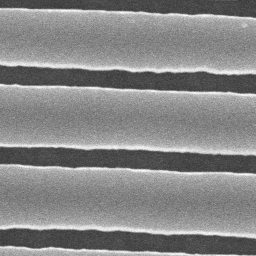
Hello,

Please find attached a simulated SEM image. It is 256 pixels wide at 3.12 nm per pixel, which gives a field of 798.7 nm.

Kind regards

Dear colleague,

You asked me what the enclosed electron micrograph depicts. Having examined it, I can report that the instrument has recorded lines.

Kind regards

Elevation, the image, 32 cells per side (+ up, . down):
................................
+++++++++++++++++...............
++++++++++++++++++++++++++++++++
++++++++++++++++++++++++++++++++
++++++++++++++++++++++++++++++++
++++++++++++++++++++++++++++++++
++++++++++++++++++++++++++++++++
++++++++++++++++++++++++++++++++
.......+.+++++++++++++++++++++++
................................
................................
+++++++++++++++++++++++.........
++++++++++++++++++++++++++++++++
++++++++++++++++++++++++++++++++
++++++++++++++++++++++++++++++++
++++++++++++++++++++++++++++++++
++++++++++++++++++++++++++++++++
++++++++++++++++++++++++++++++++
..........++++++++++++++++++++++
................................
................................
+++++++++++++++++++++++.........
++++++++++++++++++++++++++++++++
++++++++++++++++++++++++++++++++
++++++++++++++++++++++++++++++++
++++++++++++++++++++++++++++++++
++++++++++++++++++++++++++++++++
++++++++++++++++++++++++++++++++
++++++++++++++++++++++++++++++++
.............................+++
................................
++++++++++++++++................